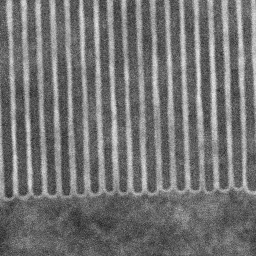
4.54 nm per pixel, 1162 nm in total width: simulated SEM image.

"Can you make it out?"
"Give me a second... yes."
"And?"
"parallel lines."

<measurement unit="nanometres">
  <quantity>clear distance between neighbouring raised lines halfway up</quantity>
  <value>45.4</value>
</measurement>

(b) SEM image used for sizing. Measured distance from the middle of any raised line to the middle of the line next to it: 65.2 nm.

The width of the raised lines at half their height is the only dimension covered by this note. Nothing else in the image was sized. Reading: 20.4 nm